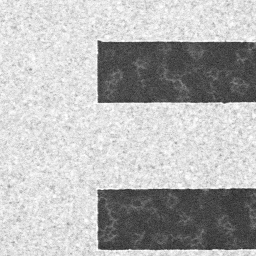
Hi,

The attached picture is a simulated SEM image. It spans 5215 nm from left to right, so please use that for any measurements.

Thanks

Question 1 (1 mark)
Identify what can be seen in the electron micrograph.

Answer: one or a few lines or trenches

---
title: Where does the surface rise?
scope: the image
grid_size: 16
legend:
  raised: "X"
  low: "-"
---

XXXXXXXXXXXXXXXX
XXXXXXXXXXXXXXXX
XXXXXXXXXXXXXXXX
XXXXXX----------
XXXXXX----------
XXXXXX----------
XXXXXXXXXXXXXXXX
XXXXXXXXXXXXXXXX
XXXXXXXXXXXXXXXX
XXXXXXXXXXXXXXXX
XXXXXXXXXXXXXXXX
XXXXXXXXXXXXXXXX
XXXXXX----------
XXXXXX----------
XXXXXX----------
XXXXXX----------